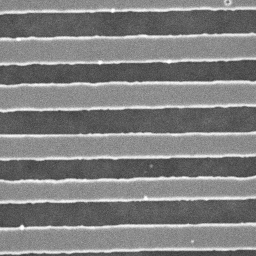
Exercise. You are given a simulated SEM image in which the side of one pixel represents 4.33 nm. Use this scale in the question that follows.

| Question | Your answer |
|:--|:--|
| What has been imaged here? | lines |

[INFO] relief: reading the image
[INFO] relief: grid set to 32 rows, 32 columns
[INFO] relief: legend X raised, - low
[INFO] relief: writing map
XXXXXXXXXXXXXXXXXXXXXXXXXXXXXXXX
XXXXXXXXXXXX--X-----------------
--------------------------------
--------------------------------
-----------------XX----XXXXXXXXX
XXXXXXXXXXXXXXXXXXXXXXXXXXXXXXXX
XXXXXXXXXXXXXXXXXXXXXXXXXXXXXXXX
XXXXXXXXXXXXXXXXXXXXXXXXXXXXXXX-
--------------------------------
--------------------------------
---------XXXXXXXXXXXXXXXXXXXXXXX
XXXXXXXXXXXXXXXXXXXXXXXXXXXXXXXX
XXXXXXXXXXXXXXXXXXXXXXXXXXXXXXXX
XXXXXXXXXXXXXXXXXXXXX-----------
--------------------------------
--------------------------------
--------------------------------
XXXXXXXXXXXXXXXXXXXXXXXXXXXXXXXX
XXXXXXXXXXXXXXXXXXXXXXXXXXXXXXXX
XXXXXXXXXXXXXXXXXXXXXXXXXXXXXXXX
--------------------------------
--------------------------------
--------XX--XXXXXXXXXXXXXXXXXXXX
XXXXXXXXXXXXXXXXXXXXXXXXXXXXXXXX
XXXXXXXXXXXXXXXXXXXXXXXXXXXXXXXX
--------------------------------
--------------------------------
--------------------------------
--XXXXXXXXXXXXXXXXXXXXXXXXXXXXXX
XXXXXXXXXXXXXXXXXXXXXXXXXXXXXXXX
XXXXXXXXXXXXXXXXXXXXXXXXXXXXXXXX
XXXXXXXXXXXXXX------------------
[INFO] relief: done